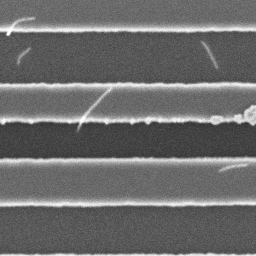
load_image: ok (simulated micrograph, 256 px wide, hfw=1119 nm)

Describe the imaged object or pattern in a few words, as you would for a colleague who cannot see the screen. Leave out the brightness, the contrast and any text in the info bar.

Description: lines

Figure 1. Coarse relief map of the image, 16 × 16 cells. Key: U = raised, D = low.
UUUUUUUUUUUUUUUU
UUUUUUUUUUUUUUUU
DDDDDDDDDDDDDDDD
DDDDDDDDDDDDDDDD
DDDDDDDDDDDDDDDD
UUUUUUUUUUUUUUUU
UUUUUUUUUUUUUUUU
UUUUUUUUUUUUUUUU
DDDDDDDDDDDDDDDD
DDDDDDDDDDDDDDDD
UUUUUUUUUUUUUUUU
UUUUUUUUUUUUUUUU
UUUUUUUUUUUUUUUU
DDDDDDDDDDDDDDDD
DDDDDDDDDDDDDDDD
DDDDDDDDDDDDDDDD